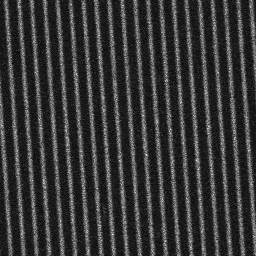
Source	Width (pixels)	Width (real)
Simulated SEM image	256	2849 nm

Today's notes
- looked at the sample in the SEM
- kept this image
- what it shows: parallel lines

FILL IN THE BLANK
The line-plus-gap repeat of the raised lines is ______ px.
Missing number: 12.9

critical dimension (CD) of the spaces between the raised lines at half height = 0.0999 µm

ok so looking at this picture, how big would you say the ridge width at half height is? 44.4 nanometres